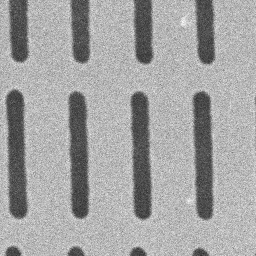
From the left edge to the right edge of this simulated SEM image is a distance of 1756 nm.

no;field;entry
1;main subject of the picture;holes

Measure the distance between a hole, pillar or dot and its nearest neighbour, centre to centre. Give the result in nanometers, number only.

427